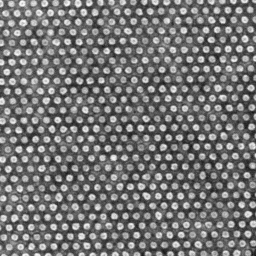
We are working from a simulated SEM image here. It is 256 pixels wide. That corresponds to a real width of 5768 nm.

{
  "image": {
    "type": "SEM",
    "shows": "a regular array of raised bodies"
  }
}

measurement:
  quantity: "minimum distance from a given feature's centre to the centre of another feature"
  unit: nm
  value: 243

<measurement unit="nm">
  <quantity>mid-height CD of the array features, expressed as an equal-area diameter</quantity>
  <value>132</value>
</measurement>